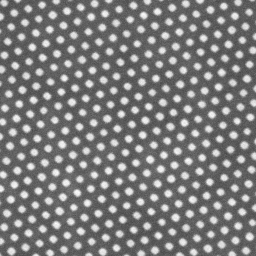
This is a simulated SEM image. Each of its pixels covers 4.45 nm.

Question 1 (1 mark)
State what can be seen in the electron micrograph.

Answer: a regular array of raised bodies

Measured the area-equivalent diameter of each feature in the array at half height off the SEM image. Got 6.56 px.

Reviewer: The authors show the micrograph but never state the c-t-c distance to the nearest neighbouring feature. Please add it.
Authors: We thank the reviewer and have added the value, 0.0626 µm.